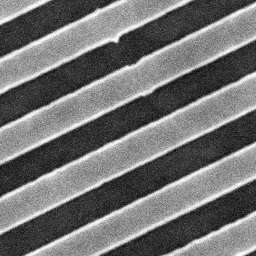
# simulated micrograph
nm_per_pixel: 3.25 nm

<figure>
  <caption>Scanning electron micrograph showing one or a few lines or trenches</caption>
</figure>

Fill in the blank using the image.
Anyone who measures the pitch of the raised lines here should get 203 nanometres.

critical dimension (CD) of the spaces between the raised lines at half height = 104 nanometres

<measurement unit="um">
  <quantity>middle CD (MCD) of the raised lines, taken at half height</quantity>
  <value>0.101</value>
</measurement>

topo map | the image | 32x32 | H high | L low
HHHHHLLLLLLLLLHHHHHHHHHLLLLLLLLL
HHHLLLLLLLLLHHHHHHHHHLLLLLLLLLHH
HLLLLLLLLLHHHHHHHHHLLLLLLLLLHHHH
LLLLLLLLHHHHHHHHHLLLLLLLLLHHHHHH
LLLLLLHHHHHHHHHLLLLLLLLLHHHHHHHH
LLLLHHHHHHHHHLLLLLLLLLHHHHHHHHLL
LLHHHHHHHHLLLLLLLLLLHHHHHHHHLLLL
HHHHHHHHLLLLLLLLLLHHHHHHHHLLLLLL
HHHHHHLLLLLLLLLLHHHHHHHHLLLLLLLL
HHHHLLLLLLLLLLHHHHHHHHLLLLLLLLLH
HHLLLLLLLLLLHHHHHHHHLLLLLLLLLHHH
LLLLLLLLLLHHHHHHHHHLLLLLLLLHHHHH
LLLLLLLHHHHHHHHHLLLLLLLLLHHHHHHH
LLLLLHHHHHHHHHLLLLLLLLLHHHHHHHHH
LLLHHHHHHHHHLLLLLLLLLHHHHHHHHHLL
LHHHHHHHHHLLLLLLLLLHHHHHHHHHLLLL
HHHHHHHHLLLLLLLLLHHHHHHHHHLLLLLL
HHHHHHLLLLLLLLLHHHHHHHHHLLLLLLLL
HHHHLLLLLLLLLHHHHHHHHHLLLLLLLLLH
HHLLLLLLLLLHHHHHHHHHLLLLLLLLLHHH
LLLLLLLLLHHHHHHHHHLLLLLLLLLHHHHH
LLLLLLLHHHHHHHHHLLLLLLLLLHHHHHHH
LLLLLHHHHHHHHHLLLLLLLLLHHHHHHHHL
LLLHHHHHHHHLLLLLLLLLLHHHHHHHHLLL
LHHHHHHHHLLLLLLLLLLHHHHHHHHLLLLL
HHHHHHHLLLLLLLLLLHHHHHHHHLLLLLLL
HHHHHLLLLLLLLLHHHHHHHHHLLLLLLLLL
HHHLLLLLLLLLHHHHHHHHHLLLLLLLLLHH
HLLLLLLLLLHHHHHHHHHLLLLLLLLLHHHH
LLLLLLLLHHHHHHHHHLLLLLLLLLHHHHHH
LLLLLLHHHHHHHHHLLLLLLLLLHHHHHHHH
LLLLHHHHHHHHHLLLLLLLLLHHHHHHHHHL